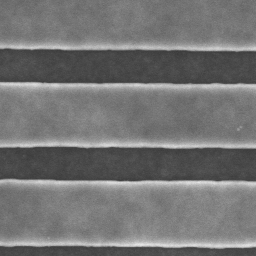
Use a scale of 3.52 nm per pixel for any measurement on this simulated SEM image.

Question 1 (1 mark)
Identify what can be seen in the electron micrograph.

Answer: lines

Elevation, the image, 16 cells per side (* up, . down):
****************
****************
****************
................
................
****************
****************
****************
****************
................
................
****************
****************
****************
****************
.............*..